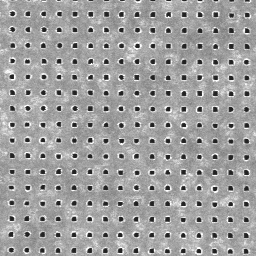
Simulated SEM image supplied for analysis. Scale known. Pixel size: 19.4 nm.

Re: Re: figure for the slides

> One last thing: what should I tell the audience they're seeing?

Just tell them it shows a regular array of holes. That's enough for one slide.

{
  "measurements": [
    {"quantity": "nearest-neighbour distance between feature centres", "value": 293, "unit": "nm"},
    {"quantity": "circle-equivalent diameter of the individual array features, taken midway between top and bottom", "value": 105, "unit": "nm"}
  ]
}